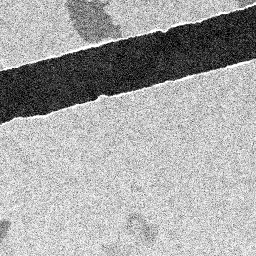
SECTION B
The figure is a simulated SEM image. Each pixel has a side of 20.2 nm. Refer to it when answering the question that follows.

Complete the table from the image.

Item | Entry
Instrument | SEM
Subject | one or a few lines or trenches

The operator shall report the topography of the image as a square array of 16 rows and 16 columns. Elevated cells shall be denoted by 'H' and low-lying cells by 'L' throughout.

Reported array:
HHHHHHHHHHHHHHHL
HHHHHHHHHHHLLLLL
HHHHHHHLLLLLLLLL
HHHHLLLLLLLLLLLL
LLLLLLLLLLLLLHHH
LLLLLLLLLHHHHHHH
LLLLLHHHHHHHHHHH
LHHHHHHHHHHHHHHH
HHHHHHHHHHHHHHHH
HHHHHHHHHHHHHHHH
HHHHHHHHHHHHHHHH
HHHHHHHHHHHHHHHH
HHHHHHHHHHHHHHHH
HHHHHHHHHHHHHHHH
HHHHHHHHHHHHHHHH
HHHHHHHHHHHHHHHH